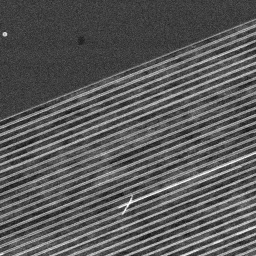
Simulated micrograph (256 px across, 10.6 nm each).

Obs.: parallel lines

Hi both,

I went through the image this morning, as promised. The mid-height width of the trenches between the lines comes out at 0.053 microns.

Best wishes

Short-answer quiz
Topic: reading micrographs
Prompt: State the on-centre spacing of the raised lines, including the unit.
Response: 6.91 px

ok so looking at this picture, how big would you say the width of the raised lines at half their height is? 19.7 nm